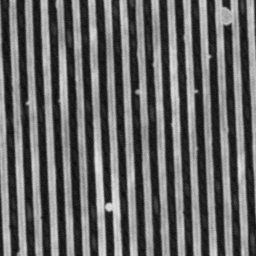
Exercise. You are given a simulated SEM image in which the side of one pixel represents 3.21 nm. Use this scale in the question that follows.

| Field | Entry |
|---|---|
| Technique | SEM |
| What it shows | parallel lines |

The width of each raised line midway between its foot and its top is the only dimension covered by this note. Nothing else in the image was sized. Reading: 18 nm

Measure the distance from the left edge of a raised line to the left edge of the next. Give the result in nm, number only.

50.8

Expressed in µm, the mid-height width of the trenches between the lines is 0.0337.